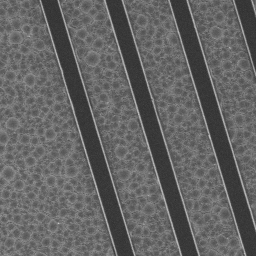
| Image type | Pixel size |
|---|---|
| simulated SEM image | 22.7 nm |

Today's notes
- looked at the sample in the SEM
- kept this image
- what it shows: parallel lines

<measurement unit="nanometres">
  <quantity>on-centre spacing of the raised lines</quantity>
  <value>1400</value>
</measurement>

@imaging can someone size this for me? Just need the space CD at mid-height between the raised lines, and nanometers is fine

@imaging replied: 1010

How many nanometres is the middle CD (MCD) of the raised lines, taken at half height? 389